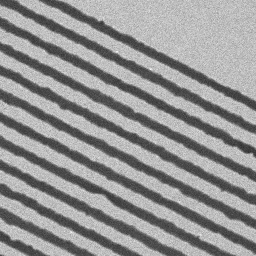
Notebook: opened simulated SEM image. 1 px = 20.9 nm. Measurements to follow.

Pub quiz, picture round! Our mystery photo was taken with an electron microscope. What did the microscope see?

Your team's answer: parallel lines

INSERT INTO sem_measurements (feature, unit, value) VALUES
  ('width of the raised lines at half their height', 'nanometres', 263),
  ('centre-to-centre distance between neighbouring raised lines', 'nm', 441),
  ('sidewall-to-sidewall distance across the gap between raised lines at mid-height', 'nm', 181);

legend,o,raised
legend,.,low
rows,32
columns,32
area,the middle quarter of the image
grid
ooo.....oooooo.....ooooooo.....o
ooooo....ooooooo.....ooooooo....
oooooo.....ooooooo.....ooooooo..
..ooooooo....ooooooo.....ooooooo
....oooooo.....ooooooo.....ooooo
o....oooooooo.....oooooo....oooo
oo......oooooo......oooooo.....o
ooooo.....ooooooo.....ooooo.....
oooooo......ooooooo....ooooooo..
..oooooo......oooooo.....ooooooo
....oooooo......oooooo.....ooooo
o.....oooooo.....ooooooo......oo
ooo.....oooooo.....ooooooo.....o
ooooo.....oooooo.....ooooooo....
oooooo......ooooooo....ooooooo..
.ooooooo.....ooooooo.....ooooooo
....ooooooo....ooooooo.....ooooo
o....oooooooo.....oooooo.....ooo
ooo.....ooooooo.....oooooo.....o
ooooo.....ooooooo.....oooooo....
ooooooo.....ooooooo....ooooooo..
..ooooooo.....ooooooo....ooooooo
....oooooo......ooooooo....ooooo
o.....ooooooo.....oooooo.....ooo
ooo.....ooooooo....oooooooo....o
ooooo.....oooooo.....ooooooo....
.oooooo.....oooooo.....ooooooo..
..ooooooo.....oooooo.....ooooooo
.....oooooo.....ooooooo....ooooo
o......oooooo.....oooooo.....ooo
oooo....ooooooo.....ooooooo....o
ooooo.....ooooooo....oooooooo...